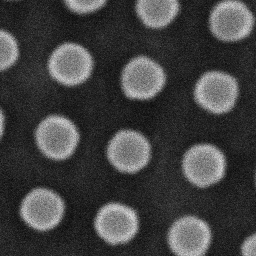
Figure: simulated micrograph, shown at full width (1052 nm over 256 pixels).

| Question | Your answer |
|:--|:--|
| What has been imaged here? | a regular array of raised bodies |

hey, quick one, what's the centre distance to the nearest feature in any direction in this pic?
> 73.2 px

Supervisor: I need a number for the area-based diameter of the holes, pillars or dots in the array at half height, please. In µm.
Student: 0.165